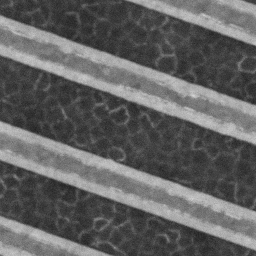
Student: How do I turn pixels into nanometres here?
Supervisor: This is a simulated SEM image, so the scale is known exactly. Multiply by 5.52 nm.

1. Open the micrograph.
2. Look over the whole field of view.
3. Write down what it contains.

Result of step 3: one or a few lines or trenches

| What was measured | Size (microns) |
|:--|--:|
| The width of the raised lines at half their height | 0.148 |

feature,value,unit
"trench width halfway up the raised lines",0.403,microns